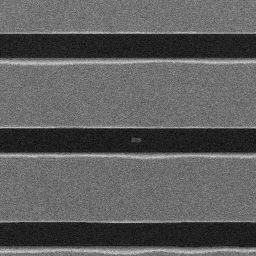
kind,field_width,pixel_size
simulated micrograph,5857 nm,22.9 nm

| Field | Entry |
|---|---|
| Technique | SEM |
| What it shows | lines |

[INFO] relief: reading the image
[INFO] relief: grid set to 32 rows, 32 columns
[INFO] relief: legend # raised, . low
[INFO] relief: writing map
################################
################################
################################
################################
................................
................................
................................
#..............#########.......#
################################
################################
################################
################################
################################
################################
################################
################################
................................
................................
................................
################################
################################
################################
################################
################################
################################
################################
################################
################################
................................
................................
................................
################################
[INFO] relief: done